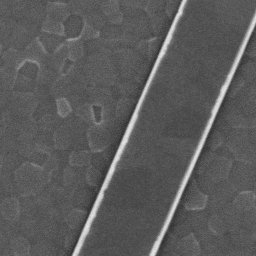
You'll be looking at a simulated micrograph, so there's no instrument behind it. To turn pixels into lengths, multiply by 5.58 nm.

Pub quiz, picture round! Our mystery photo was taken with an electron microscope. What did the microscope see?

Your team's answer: one or a few lines or trenches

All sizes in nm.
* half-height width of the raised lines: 407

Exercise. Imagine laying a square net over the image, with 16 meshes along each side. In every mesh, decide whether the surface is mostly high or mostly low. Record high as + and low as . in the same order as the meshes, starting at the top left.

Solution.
...........+++++
...........+++++
..........+++++.
..........+++++.
..........+++++.
.........+++++..
.........+++++..
........+++++...
........+++++...
.......+++++....
.......+++++....
.......++++.....
......+++++.....
......+++++.....
.....+++++......
.....+++++......